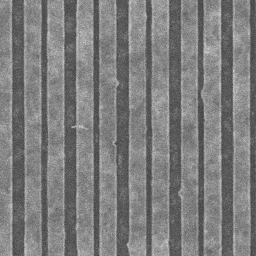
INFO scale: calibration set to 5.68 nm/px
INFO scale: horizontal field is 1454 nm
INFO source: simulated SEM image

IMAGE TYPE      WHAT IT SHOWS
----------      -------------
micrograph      parallel lines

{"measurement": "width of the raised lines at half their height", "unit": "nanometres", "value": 90.9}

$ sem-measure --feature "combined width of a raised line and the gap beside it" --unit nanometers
148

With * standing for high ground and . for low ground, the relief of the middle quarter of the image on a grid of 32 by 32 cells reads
...****..****....***..****....**
...****..****....***..****....**
...****..****....***..****....**
...****..****....***..****....**
...****..*****...***..****....**
...****..****....***..****....**
...****..****....***..****....**
...****..****....***..****....**
...****..****....***..****....**
...****..****....***..****....**
...****..****....***..****....**
...****..****....***..****....**
...****..****....***..****....**
...****..****....***..****....**
...****..****....***..****....**
...****..****....****.****....**
...****..****....****.****....**
...****..****....***..****....**
...****..****....***..****....**
...****..****....***..****....**
...****..****....***..****....**
...****..****....***..****....**
...****..****....***..****....**
...****..****....***..****....**
...****..****....***..****....**
...****..****....***..****....**
...****..****...****..****....**
...****..****...****..****....**
...****..****...****..****....**
...****..****...****..****....**
...****..****....***..****....**
...****..****....***..****...***